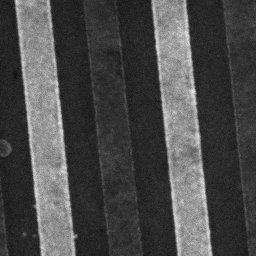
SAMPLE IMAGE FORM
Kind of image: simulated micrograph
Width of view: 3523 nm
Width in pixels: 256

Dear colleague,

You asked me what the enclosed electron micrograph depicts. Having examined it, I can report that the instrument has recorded lines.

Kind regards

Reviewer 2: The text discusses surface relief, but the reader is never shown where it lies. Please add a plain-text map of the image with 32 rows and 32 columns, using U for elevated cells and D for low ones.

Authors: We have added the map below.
DDUUUUDDDDUUUUDDDDDUUUUDDDDDUUUU
DDUUUUDDDDDUUUUDDDDUUUUDDDDDUUUU
DDUUUUDDDDDUUUUDDDDUUUUDDDDDUUUU
DDUUUUDDDDDUUUUDDDDUUUUUDDDDUUUU
DDUUUUUDDDDUUUUDDDDUUUUUDDDDUUUU
DDUUUUUDDDDUUUUDDDDDUUUUDDDDDUUU
DDDUUUUDDDDUUUUDDDDDUUUUDDDDDUUU
DDDUUUUDDDDUUUUDDDDDUUUUDDDDDUUU
DDDUUUUDDDDUUUUDDDDDUUUUDDDDDUUU
DDDUUUUDDDDUUUUDDDDDUUUUDDDDDUUU
DDDUUUUDDDDDUUUUDDDDUUUUDDDDDUUU
DDDUUUUDDDDDUUUUDDDDUUUUDDDDDUUU
DDDUUUUDDDDDUUUUDDDDUUUUDDDDDUUU
DDDUUUUUDDDDUUUUDDDDUUUUUDDDDUUU
DDDUUUUUDDDDUUUUDDDDDUUUUDDDDUUU
DDDDUUUUDDDDUUUUDDDDDUUUUDDDDUUU
DDDDUUUUDDDDUUUUDDDDDUUUUDDDDDUU
DDDDUUUUDDDDUUUUDDDDDUUUUDDDDDUU
DDDDUUUUDDDDUUUUDDDDDUUUUDDDDDUU
DDDDUUUUDDDDUUUUDDDDDUUUUDDDDDUU
DDDDUUUUDDDDDUUUUDDDDUUUUDDDDDUU
DDDDUUUUDDDDDUUUUDDDDUUUUDDDDDUU
DDDDUUUUDDDDDUUUUDDDDUUUUDDDDDUU
DDDDUUUUUDDDDUUUUDDDDUUUUUDDDDUU
DDDDUUUUUDDDDUUUUDDDDUUUUUDDDDUU
DDDDDUUUUDDDDUUUUDDDDDUUUUDDDDDU
DDDDDUUUUDDDDUUUUDDDDDUUUUDDDDDU
UDDDDUUUUDDDDUUUUDDDDDUUUUDDDDDU
UDDDDUUUUDDDDUUUUDDDDDUUUUDDDDDU
UDDDDUUUUDDDDUUUUDDDDDUUUUDDDDDU
UDDDDUUUUDDDDDUUUUDDDDUUUUDDDDDU
UDDDDUUUUDDDDDUUUUDDDDUUUUDDDDDU